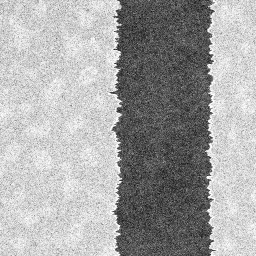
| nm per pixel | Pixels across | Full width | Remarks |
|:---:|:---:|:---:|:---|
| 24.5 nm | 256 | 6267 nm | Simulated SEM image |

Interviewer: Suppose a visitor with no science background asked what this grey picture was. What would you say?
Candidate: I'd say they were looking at one or a few lines or trenches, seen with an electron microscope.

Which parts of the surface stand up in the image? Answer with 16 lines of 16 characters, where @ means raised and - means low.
@@@@@@@------@@@
@@@@@@@------@@@
@@@@@@@------@@@
@@@@@@@------@@@
@@@@@@@------@@@
@@@@@@@------@@@
@@@@@@@------@@@
@@@@@@@------@@@
@@@@@@@------@@@
@@@@@@@------@@@
@@@@@@@------@@@
@@@@@@@------@@@
@@@@@@@------@@@
@@@@@@@------@@@
@@@@@@@------@@@
@@@@@@@------@@@